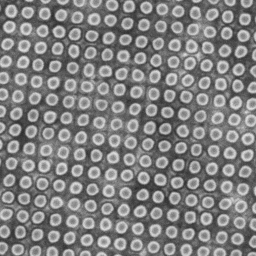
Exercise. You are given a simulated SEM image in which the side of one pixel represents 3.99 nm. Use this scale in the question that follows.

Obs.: a regular array of raised bodies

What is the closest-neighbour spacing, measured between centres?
16.2 px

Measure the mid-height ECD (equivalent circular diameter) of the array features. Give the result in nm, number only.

44.8